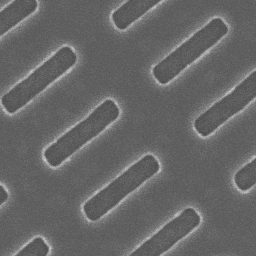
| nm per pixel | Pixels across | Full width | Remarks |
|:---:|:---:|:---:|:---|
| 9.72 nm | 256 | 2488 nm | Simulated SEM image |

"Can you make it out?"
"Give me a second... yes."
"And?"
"holes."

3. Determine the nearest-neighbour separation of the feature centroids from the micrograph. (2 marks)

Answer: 0.658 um